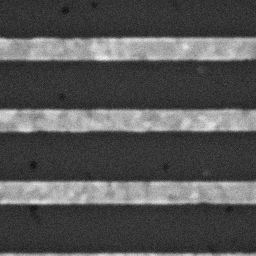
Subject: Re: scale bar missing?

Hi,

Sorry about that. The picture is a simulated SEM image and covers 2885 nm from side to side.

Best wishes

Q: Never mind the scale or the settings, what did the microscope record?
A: lines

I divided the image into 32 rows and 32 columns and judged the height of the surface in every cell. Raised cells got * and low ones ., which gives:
................................
................................
................................
................................
................................
********************************
********************************
................................
................................
................................
................................
................................
................................
................................
********************************
********************************
................................
................................
................................
................................
................................
................................
................................
********************************
********************************
................................
................................
................................
................................
................................
................................
................................